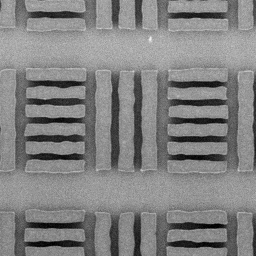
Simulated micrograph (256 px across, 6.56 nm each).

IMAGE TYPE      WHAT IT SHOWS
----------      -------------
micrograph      groups of lines, slits or small figures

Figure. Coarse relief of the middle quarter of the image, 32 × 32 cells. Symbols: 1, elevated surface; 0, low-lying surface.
00000000000000000000000000000000
11111000000000000000000000000011
11111000111100111000111000111111
11111000111000111000111000111111
00000000111100111000111000000000
00000000111100111000111000000000
11111000111100111000111000111111
11111000111100111000111000111111
00001000111100111000111000111111
00000000111100111000111000000000
00111000111100111000111000000100
11111000111100111000111000111111
11111000111100111000111000111111
00000000111100111000111000000001
00000000111100111000111000000000
11111000111100111000111000111111
11111000111000111000111000111111
11011000111000111000111000111111
00000000111000111000111000000000
11000000111100111000111000000000
11111000111100111000111000111111
11111000111100111000111000111111
11000000111100111000111000011011
00000000111000111000111000000000
11111000111100111000111000111111
11111000111100111000111000111111
11111000000000111000000000111111
00000000000000000000000000000000
00000000000000000000000000000000
00000000000000000000000000000000
00000000000000000000000000000000
00000000000000000000000000000000